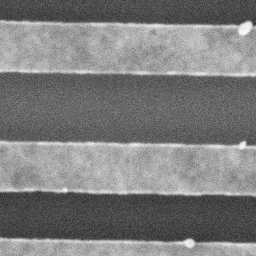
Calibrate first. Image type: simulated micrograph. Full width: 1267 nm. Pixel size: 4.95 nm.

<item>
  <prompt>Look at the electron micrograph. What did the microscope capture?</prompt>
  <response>lines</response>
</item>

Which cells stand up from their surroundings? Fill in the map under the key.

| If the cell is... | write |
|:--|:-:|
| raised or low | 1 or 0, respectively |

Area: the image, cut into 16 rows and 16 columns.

0000000000000000
1111111100000001
1111111111111111
1111111111111111
0000111111111111
0000000000000000
0000000000000000
0000000000000000
0000000000000000
1111111111111111
1111111111111111
1111111111111111
0000000000000000
0000000000000000
0000000000000000
1111111111111111